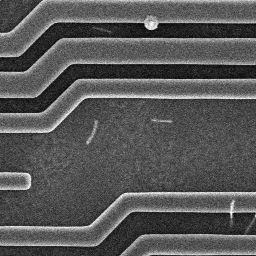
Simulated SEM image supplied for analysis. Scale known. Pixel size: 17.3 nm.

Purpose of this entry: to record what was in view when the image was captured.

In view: groups of lines, slits or small figures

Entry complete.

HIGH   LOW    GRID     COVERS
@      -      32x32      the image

-----@@@@@@@@@@@@@@@@@@@@@@@@@@@
----@@@@@@@@@@@@@@@@@@@@@@@@@@@@
---@@@@@@@@@@@@@@@@@@@@@@@@@@@@@
--@@@@------------@-------------
@@@@@---------------------------
@@@@---@@@@@@@@@@@@@@@@@@@@@@@@@
@@@---@@@@@@@@@@@@@@@@@@@@@@@@@@
-----@@@@@@@@@@@@@@@@@@@@@@@@@@@
----@@@@------------------------
@@@@@@@-------------------------
@@@@@@---@@@@@@@@@@@@@@@@@@@@@@@
@@@@@---@@@@@@@@@@@@@@@@@@@@@@@@
-------@@@----------------------
------@@@-----------------------
@@@@@@@@------------------------
@@@@@@@-------------------------
--------------------------------
--------------------------------
--------------------------------
--------------------------------
--------------------------------
--------------------------------
@@@@----------------------------
@@@@----------------------------
---------------@@@@@@@@@@@@@@@@@
--------------@@@@@@@@@@@@@@@@@@
-------------@@@@-----------@---
------------@@@-----------------
@@@@@@@@@@@@@@------------------
@@@@@@@@@@@@@-----@@@@@@@@@@@@@@
@@@@@@@@@@@@----@@@@@@@@@@@@@@@@
---------------@@@@@@@@@@@@@@@@@